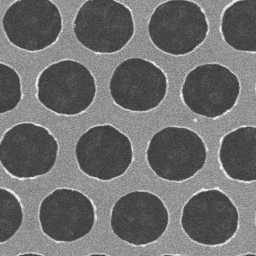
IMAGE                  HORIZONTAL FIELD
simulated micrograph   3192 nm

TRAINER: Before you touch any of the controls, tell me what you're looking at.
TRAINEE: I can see a regular array of holes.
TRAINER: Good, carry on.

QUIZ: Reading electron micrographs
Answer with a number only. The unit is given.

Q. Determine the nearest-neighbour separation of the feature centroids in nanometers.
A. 897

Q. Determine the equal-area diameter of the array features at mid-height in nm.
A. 692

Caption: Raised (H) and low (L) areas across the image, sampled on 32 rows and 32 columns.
HHLLLLLHHHLLLLLHHHHHLLLLHHHHHLLL
HLLLLLLHHHLLLLLLHHHLLLLLLHHHLLLL
LLLLLLLLHLLLLLLLLHHLLLLLLLHHLLLL
LLLLLLLLHLLLLLLLLHHLLLLLLLHHLLLL
HLLLLLLHHLLLLLLLHHHLLLLLLLHHLLLL
HHLLLLHHHHLLLLLLHHHLLLLLLHHHHLLL
HHHHHHHHHHHHLLHHHHHHHLLLHHHHHHHH
HHHHHHHHLHHHHHHHLLHHHHHHHHHHHHHH
LHHHHHLLLLLHHHHLLLLLHHHHLLLLHHHH
LLHHHLLLLLLLHHLLLLLLLHHLLLLLLHHH
LLLHHLLLLLLLHHLLLLLLLHHLLLLLLLHH
LLLHHLLLLLLLHHLLLLLLLHHLLLLLLLHH
LLHHHLLLLLLLHHLLLLLLHHHLLLLLLLHH
LLHHHHLLLLLHHHHHLLLHHHHHLLLLLHHH
HHHHHHHHHHHHHHHHHHHHHHHHHHLHHHHH
HHHLHHHHHHHHHHHHHHHHHHHHHHHHHHHH
HLLLLLHHHHHLLLLHHHHHLLLLHHHHHLLL
LLLLLLLHHHLLLLLLHHHLLLLLLHHHLLLL
LLLLLLLHHLLLLLLLHHHLLLLLLLHHLLLL
LLLLLLLHHHLLLLLLLHLLLLLLLLHHLLLL
LLLLLLLHHHLLLLLLHHHLLLLLLLHHLLLL
HLLLLLHHHHLLLLLLHHHLLLLLLHHHLLLL
HHHHHHHHHHHHHHHHHHHHHLLHHHHHHHLL
HHHHHHHHHHHHHHHHHHHHHHHHHHHHHHHH
LLHHHHLLLLLHHHHLLLLLHHHHLLLLHHHH
LLHHHLLLLLLHHHLLLLLLHHHLLLLLLHHH
LLLHHLLLLLLLHHLLLLLLLHHLLLLLLLHH
LLLHHLLLLLLLHHLLLLLLLHHLLLLLLLHH
LLHHHLLLLLLHHHLLLLLLLHHLLLLLLLHH
LLHHHHLLLLHHHHHLLLLLHHHHLLLLLHHH
HHHHHHHHHHHHHHHHLLHHHHHHHHLHHHHH
HHHHHHHHHHHHHHHHHHHHHHHHHHHHHHHH